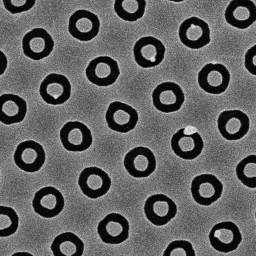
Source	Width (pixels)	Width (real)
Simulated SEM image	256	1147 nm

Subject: a regular array of ring-shaped grooves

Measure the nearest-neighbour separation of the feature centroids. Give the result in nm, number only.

221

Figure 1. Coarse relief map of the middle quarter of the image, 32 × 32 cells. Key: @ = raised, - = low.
@@@@@@--@@@--@@@@@@----@@@@@@@@@
@@@@@---@@@@--@@@@@@@@@@@@@@@@@@
@@@@@---@@@---@@@@@@@@@@@@@@@@@@
-@@@@@-------@@@@@@@@@@@@@@@@@@@
-@@@@@@------@@@@@@@@@@@@--@@@@@
--@@@@@@@--@@@@@@@@@@@@------@@@
--@@@@@@@@@@@@@@@@@@@@--------@@
--@@@@@@@@@@@@@@@@@@@@--@@@---@@
-@@@@@@@@@@@@@@@@@@@@@--@@@@--@@
@@@@@@@@@@@@@-@@@@@@@@--@@@@--@@
@@@@@@@@@@@------@@@@@@------@@@
@@@@@@@@@@@-------@@@@@------@@@
@@@@@@@@@@--@@@@--@@@@@@@@@@@@@@
@@@@@@@@@@--@@@@---@@@@@@@@@@@@@
@---@@@@@@@--@@@--@@@@@@@@@@@@@@
------@@@@@-------@@@@@@@@@@@@@@
--@@--@@@@@@-----@@@@@@@@@@@@-@@
-@@@---@@@@@@@@@@@@@@@@@@@@@--@@
-@@@@--@@@@@@@@@@@@@@@@@@@@--@@@
-@@@---@@@@@@@@@@@@@@@@@@@@--@@@
------@@@@@@@@@@@@@@@@@@@@@--@@@
@----@@@@@@@@@@@@-----@@@@@---@@
@@@@@@@@@@@@@@@@------@@@@@@----
@@@@@@@@@@@@@@@---@@@--@@@@@@---
@@@@@@@@@@@@@@@--@@@@--@@@@@@@@@
@@@@@@@@@@@@@@@---@@@--@@@@@@@@@
@@@@@-----@@@@@@---@---@@@@@@@@@
@@@@-------@@@@@------@@@@@@@@@@
@@@@--@@@---@@@@@@@@@@@@@@@@@@@@
@@@---@@@@--@@@@@@@@@@@@@@@@@@@@
@@@@--@@@---@@@@@@@@@@@@@@@@@@@@
@@@@-------@@@@@@@@@@@@@@@@@@@@@